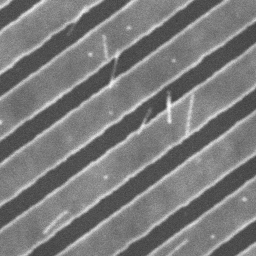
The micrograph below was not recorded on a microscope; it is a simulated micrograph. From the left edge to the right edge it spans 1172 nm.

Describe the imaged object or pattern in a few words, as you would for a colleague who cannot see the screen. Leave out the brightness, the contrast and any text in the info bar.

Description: lines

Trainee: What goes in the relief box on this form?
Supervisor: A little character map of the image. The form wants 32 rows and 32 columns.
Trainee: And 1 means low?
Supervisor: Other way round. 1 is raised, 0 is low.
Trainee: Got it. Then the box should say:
10000111111100001111111100011111
00011111111000011111110000111111
00111111110001111111100001111111
11111111000011111111000111111110
11111110000111111100001111111000
11111000011111111000111111110000
11110000111111100001111111100001
11000011111111000011111110000111
10000111111110001111111100001111
00001111111000011111111000111111
00111111110000111111100001111111
01111111100011111111000011111110
11111110000111111100001111111100
11111100001111111000011111111000
11110000111111110000111111100001
11100001111111000011111111000111
11000111111110000111111100001111
00001111111100011111111000011111
00011111110000111111110001111111
01111111100001111111000011111111
11111110000111111110000111111100
11111100001111111000011111111000
11111000011111110000111111100001
11100001111111100001111111000011
11000011111110000111111110000111
00000111111100001111111000011111
00011111111000011111110000111111
00111111100001111111100001111111
11111111000011111110000111111100
11111110001111111100001111111000
11111000011111110000111111110000
11110000111111100001111111100011